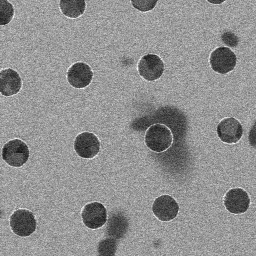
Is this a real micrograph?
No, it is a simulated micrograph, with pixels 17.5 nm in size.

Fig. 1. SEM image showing a regular array of raised bodies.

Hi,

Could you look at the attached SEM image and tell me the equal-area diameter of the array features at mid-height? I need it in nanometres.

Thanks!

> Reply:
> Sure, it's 479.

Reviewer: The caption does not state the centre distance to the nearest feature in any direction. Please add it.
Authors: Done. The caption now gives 1230 nm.